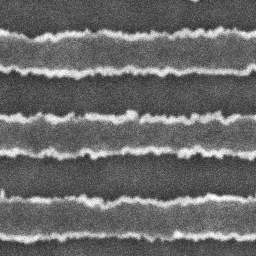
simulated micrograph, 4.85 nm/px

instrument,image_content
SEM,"one or a few lines or trenches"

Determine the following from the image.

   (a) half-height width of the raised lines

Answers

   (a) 198 nanometers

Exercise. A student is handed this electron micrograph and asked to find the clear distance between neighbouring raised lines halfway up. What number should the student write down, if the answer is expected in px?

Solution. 41.6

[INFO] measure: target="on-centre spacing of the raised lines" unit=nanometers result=400